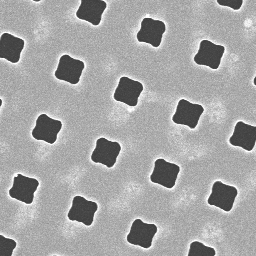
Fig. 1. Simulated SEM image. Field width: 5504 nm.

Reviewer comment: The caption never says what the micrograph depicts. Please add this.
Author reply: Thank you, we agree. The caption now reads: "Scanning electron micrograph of a regular array of holes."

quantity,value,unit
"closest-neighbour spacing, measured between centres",1.35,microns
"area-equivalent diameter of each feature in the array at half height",0.598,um